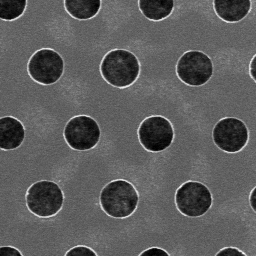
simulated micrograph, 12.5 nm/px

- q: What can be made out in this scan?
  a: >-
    a regular array of holes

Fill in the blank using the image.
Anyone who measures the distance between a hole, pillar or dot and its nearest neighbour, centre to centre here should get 930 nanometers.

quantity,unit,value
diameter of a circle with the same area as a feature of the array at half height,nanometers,440